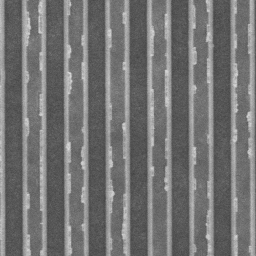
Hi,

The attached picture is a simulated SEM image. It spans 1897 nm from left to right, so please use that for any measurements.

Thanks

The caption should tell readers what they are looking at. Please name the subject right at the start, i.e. parallel lines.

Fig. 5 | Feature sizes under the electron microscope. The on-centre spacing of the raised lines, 309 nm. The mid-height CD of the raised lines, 149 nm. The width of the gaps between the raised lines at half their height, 156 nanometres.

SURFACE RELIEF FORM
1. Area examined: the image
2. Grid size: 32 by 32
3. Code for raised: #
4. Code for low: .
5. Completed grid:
...##...###..###...##...##...##.
...##...###..###...##...##...##.
...##...###..###...##...##...##.
...##...###..###...##...##...###
...##...###..###...##...##...###
...##...###..###...##...##...###
...##...###..###...##...##...###
...##...###..###...##...##...###
...##...###..###...##...##...###
...##...###..###...##...##...###
...##...###..###...##...##...###
...##...###..###...##...##...###
...##...###..###...##...##...###
...##...###..###...##...##...###
...##...###..###...##...##...###
...##...###..###...##...##...###
...##...###..###...##...##...###
...##...###..###...##...##...###
...##...###..###...##...##...###
...##...###..###...##...##...###
...##...###..###...##...##...###
...##...###..###...##...##...###
...##...###..###...##...##...###
...##...###...##...##...##...###
...##...###...##...##...##...###
...##...###...##...##...##...###
...###..###...##...##...##...###
...###..###...##...##...##...###
...###..###...##...##...##...###
...###..###...##...##...##...###
...###..###...##...##...##...###
...###..###...##...##...##...###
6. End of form